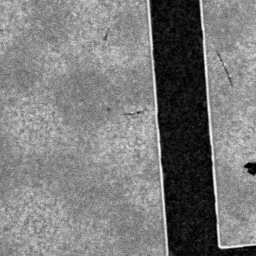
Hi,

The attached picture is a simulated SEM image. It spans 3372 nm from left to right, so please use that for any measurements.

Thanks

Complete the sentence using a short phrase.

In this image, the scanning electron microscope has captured one or a few lines or trenches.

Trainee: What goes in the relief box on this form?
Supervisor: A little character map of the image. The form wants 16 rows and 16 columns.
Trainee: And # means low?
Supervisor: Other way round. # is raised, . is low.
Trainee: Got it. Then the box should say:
#########....###
#########....###
#########....###
##########...###
##########...###
##########...###
##########...###
##########...###
##########...###
##########...###
##########...###
##########...###
##########....##
##########....##
##########....##
##########......